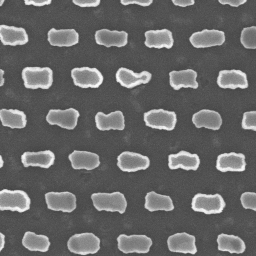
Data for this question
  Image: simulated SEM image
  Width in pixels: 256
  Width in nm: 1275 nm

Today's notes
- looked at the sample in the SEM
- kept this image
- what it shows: a regular array of raised bodies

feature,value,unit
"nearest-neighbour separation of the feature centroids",232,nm